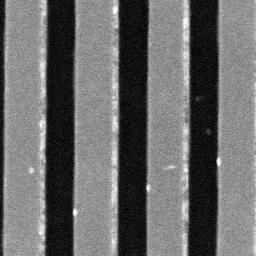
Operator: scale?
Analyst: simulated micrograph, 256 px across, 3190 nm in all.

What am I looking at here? lines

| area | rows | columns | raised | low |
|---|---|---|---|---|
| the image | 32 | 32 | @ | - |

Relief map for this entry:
-@@@@@----@@@@@----@@@@@----@@@@
-@@@@@----@@@@@----@@@@@----@@@@
-@@@@@----@@@@@----@@@@@----@@@@
-@@@@@----@@@@@----@@@@@----@@@@
-@@@@@----@@@@@----@@@@@----@@@@
-@@@@@----@@@@@----@@@@@----@@@@
-@@@@@----@@@@@----@@@@@----@@@@
-@@@@@----@@@@@----@@@@@----@@@@
-@@@@@----@@@@@----@@@@@----@@@@
-@@@@@----@@@@@----@@@@@----@@@@
-@@@@@----@@@@@----@@@@@----@@@@
-@@@@@----@@@@@----@@@@@----@@@@
-@@@@@---@@@@@@----@@@@@----@@@@
-@@@@@---@@@@@@----@@@@@----@@@@
-@@@@@---@@@@@@----@@@@@---@@@@@
-@@@@@---@@@@@@----@@@@@---@@@@@
-@@@@@---@@@@@@----@@@@@---@@@@@
-@@@@@---@@@@@@----@@@@----@@@@@
-@@@@@---@@@@@@----@@@@----@@@@@
-@@@@@---@@@@@@----@@@@----@@@@@
-@@@@@---@@@@@@----@@@@----@@@@@
-@@@@@---@@@@@@----@@@@----@@@@@
-@@@@----@@@@@@----@@@@----@@@@@
-@@@@----@@@@@@---@@@@@----@@@@@
-@@@@----@@@@@@----@@@@----@@@@@
-@@@@----@@@@@@----@@@@----@@@@@
-@@@@----@@@@@@----@@@@----@@@@@
-@@@@----@@@@@@----@@@@----@@@@@
-@@@@----@@@@@@----@@@@----@@@@@
-@@@@----@@@@@@----@@@@----@@@@@
-@@@@----@@@@@@----@@@@----@@@@@
-@@@@----@@@@@@----@@@@----@@@@@